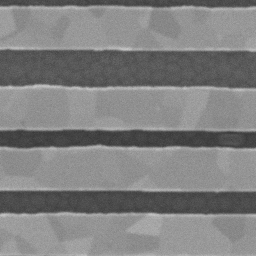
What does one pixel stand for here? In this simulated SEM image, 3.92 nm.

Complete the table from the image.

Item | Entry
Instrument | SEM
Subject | lines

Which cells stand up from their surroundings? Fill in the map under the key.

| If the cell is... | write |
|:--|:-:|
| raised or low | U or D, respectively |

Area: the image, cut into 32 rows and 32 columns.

DDDDDDDDDDDDDDDDDDDDDDDDDDDDDDDD
UUUUUUUUUUUUUUUUUUUUUUUUUUUUUUUU
UUUUUUUUUUUUUUUUUUUUUUUUUUUUUUUU
UUUUUUUUUUUUUUUUUUUUUUUUUUUUUUUU
UUUUUUUUUUUUUUUUUUUUUUUUUUUUUUUU
UUUUUUUUUUUUUUUUUUUUUUUUUUUUUUUU
DDDDDDDDDDDDDDDDDDDDDDDDDDDDDDDD
DDDDDDDDDDDDDDDDDDDDDDDDDDDDDDDD
DDDDDDDDDDDDDDDDDDDDDDDDDDDDDDDD
DDDDDDDDDDDDDDDDDDDDDDDDDDDDDDDD
DDDDDDDDDDDDDDDDDDDDDDDDDDDDDDDD
UUUUUUUUUUUUUUUUUUUUUUUUUUUUUUUU
UUUUUUUUUUUUUUUUUUUUUUUUUUUUUUUU
UUUUUUUUUUUUUUUUUUUUUUUUUUUUUUUU
UUUUUUUUUUUUUUUUUUUUUUUUUUUUUUUU
UUUUUUUUUUUUUUUUUUUUUUUUUUUUUUUU
DDDDDDDDDDDDDDDDDDDDDDDDDDDDDDDD
DDDDDDDDDDDDDDDDDDDDDDDDDDDDDDDD
UDDDDDUDUUUUUUUUUUDDUUUUDUDDDDDD
UUUUUUUUUUUUUUUUUUUUUUUUUUUUUUUU
UUUUUUUUUUUUUUUUUUUUUUUUUUUUUUUU
UUUUUUUUUUUUUUUUUUUUUUUUUUUUUUUU
UUUUUUUUUUUUUUUUUUUUUUUUUUUUUUUU
UUUUUUUUUUUUUUUUUUUUUUUUUUUUUUUU
DDDDDDDDDDDDDDDDDDDDDDDDDDDDDDDD
DDDDDDDDDDDDDDDDDDDDDDDDDDDDDDDD
DDDDDDDDDDDDDDDDDDDDDDDDDDDDDDDD
UUUUUUUUUUUUUUUUUUUUUUUUUUUUUUUU
UUUUUUUUUUUUUUUUUUUUUUUUUUUUUUUU
UUUUUUUUUUUUUUUUUUUUUUUUUUUUUUUU
UUUUUUUUUUUUUUUUUUUUUUUUUUUUUUUU
UUUUUUUUUUUUUUUUUUUUUUUUUUUUUUUU